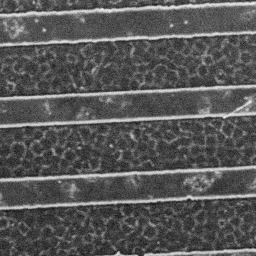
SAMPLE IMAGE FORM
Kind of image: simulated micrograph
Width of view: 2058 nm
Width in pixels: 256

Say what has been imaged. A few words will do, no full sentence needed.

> one or a few lines or trenches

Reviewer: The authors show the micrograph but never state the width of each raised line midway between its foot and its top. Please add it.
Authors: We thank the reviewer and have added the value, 232 nanometers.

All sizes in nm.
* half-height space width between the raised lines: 425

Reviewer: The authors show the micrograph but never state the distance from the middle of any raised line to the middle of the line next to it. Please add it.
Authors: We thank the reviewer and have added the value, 0.657 um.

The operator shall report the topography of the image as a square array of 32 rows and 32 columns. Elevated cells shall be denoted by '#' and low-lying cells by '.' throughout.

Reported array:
............................####
........########################
################################
################################
#########################.......
###.............................
................................
................................
................................
................................
................................
...............#.###############
################################
################################
#########################...#...
######..........................
................................
................................
................................
................................
................................
....................############
################################
################################
###############################.
##########......................
................................
................................
................................
................................
................................
...........................#####